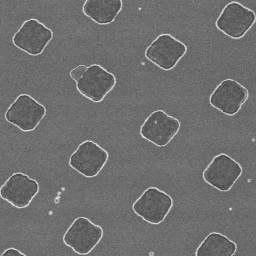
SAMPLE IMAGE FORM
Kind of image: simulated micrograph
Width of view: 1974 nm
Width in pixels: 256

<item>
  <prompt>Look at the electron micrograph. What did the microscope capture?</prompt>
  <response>a regular array of holes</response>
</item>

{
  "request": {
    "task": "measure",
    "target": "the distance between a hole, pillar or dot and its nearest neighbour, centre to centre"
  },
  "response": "0.586 um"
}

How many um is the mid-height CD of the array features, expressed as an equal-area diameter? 0.26